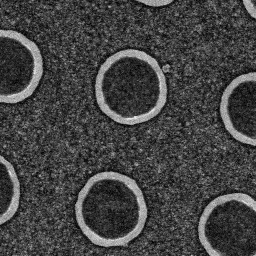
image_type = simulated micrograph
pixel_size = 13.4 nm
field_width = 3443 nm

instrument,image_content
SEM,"raised bodies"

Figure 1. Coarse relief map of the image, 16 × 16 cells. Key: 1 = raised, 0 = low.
0000000000000000
0000000000000000
1000000000000000
1100000110000000
1100001111000000
1100001111000011
0000001111000011
0000000010000011
0000000000000001
0000000000000000
1000000000000000
1000001100000000
1000011110000010
0000011110000111
0000011110000111
0000000000000111